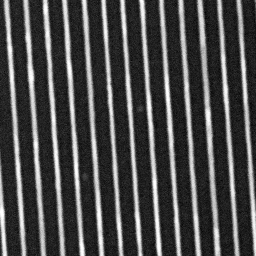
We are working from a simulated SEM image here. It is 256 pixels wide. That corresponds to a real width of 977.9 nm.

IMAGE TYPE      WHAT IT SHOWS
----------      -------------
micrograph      parallel lines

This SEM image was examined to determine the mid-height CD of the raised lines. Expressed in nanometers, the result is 13.3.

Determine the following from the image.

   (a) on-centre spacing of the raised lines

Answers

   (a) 73.9 nanometres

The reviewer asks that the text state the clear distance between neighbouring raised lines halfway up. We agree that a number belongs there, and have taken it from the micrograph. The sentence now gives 62.9 nm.